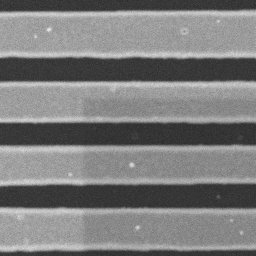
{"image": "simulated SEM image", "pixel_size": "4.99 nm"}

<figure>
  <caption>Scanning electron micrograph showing lines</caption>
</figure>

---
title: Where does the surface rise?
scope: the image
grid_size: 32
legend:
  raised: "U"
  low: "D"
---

DDDDDDDDDDDDDDDDDDDDDDDDDDDDDDDD
DUUUUUUUUUUUUUUUUUUUUUUUUUUUUUUU
UUUUUUUUUUUUUUUUUUUUUUUUUUUUUUUU
UUUUUUUUUUUUUUUUUUUUUUUUUUUUUUUU
UUUUUUUUUUUUUUUUUUUUUUUUUUUUUUUU
UUUUUUUUUUUUUUUUUUUUUUUUUUUUUUUU
UUUUUUUUUUUUUUUUUUUUUUUUUUUUUUUU
DDDDDDDDDDDDDDDDDDDDDDDDDDDDDDDD
DDDDDDDDDDDDDDDDDDDDDDDDDDDDDDDD
DDDDDDDDDDDDDDDDDDDDDDDDDDDDDDDD
UUUUUUUUUUUUUUUUUUUUUUUUUUUUUUUU
UUUUUUUUUUUUUUUUUUUUUUUUUUUUUUUU
UUUUUUUUUUUUUUUUUUUUUUUUUUUUUUUU
UUUUUUUUUUUUUUUUUUUUUUUUUUUUUUUU
UUUUUUUUUUUUUUUUUUUUUUUUUUUUUUUU
DDDDDDDDDDDDDDDDDDDDDDDDDDDDDDDD
DDDDDDDDDDDDDDDDDDDDDDDDDDDDDDDD
DDDDDDDDDDDDDDDDDDDDDDDDDDDDDDDD
UUUUUUUUUUUUUUUUUUUUUUUUUUUUUUUU
UUUUUUUUUUUUUUUUUUUUUUUUUUUUUUUU
UUUUUUUUUUUUUUUUUUUUUUUUUUUUUUUU
UUUUUUUUUUUUUUUUUUUUUUUUUUUUUUUU
UUUUUUUUUUUUUUUUUUUUUUUUUUUUUUUU
DDDDDDDDDDDDDDDDDDDDDDDDDDDDDDDD
DDDDDDDDDDDDDDDDDDDDDDDDDDDDDDDD
DDDDDDDDDDDDDDDDDDDDDDDDDDDDDDDD
UUUUUUUUUUUUUUUUUUUUUUUUUUUUUUUU
UUUUUUUUUUUUUUUUUUUUUUUUUUUUUUUU
UUUUUUUUUUUUUUUUUUUUUUUUUUUUUUUU
UUUUUUUUUUUUUUUUUUUUUUUUUUUUUUUU
UUUUUUUUUUUUUUUUUUUUUUUUUUUUUUUU
DDDDDDDDDDDDDDDDDDDDDDDDDDDDDDDD